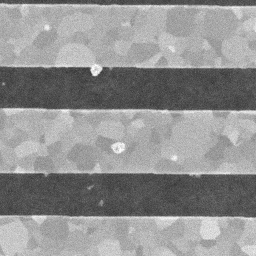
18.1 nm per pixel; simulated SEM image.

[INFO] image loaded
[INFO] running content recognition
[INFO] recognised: lines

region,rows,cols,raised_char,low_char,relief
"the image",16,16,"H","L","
HHHHHHHHHHHHHHHH
HHHHHHHHHHHHHHHH
HHHHHHHHHHHHHHHH
HHHHHHHHHHHHHHHH
LLLLLLLLLLLLLLLL
LLLLLLLLLLLLLLLL
LLLLLLLLLLLLLLLL
HHHHHHHHHHHHHHHH
HHHHHHHHHHHHHHHH
HHHHHHHHHHHHHHHH
HHHHHHHHHHHHHHHH
LLLLLLLLLLLLLLLL
LLLLLLLLLLLLLLLL
LLLLLLLLLLLLLLLL
HHHHHHHHHHHHHHHH
HHHHHHHHHHHHHHHH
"